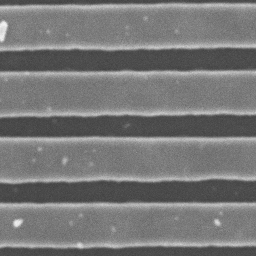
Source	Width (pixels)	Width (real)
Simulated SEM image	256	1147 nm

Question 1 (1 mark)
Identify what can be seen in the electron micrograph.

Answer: lines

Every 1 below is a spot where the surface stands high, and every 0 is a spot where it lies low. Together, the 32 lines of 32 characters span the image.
00000000000000000001111111111111
11111111111111111111111111111111
11111111111111111111111111111111
11111111111111111111111111111111
11111111111111111111111111111111
11111111111111111111111111111111
00000000000000000000000000000000
00000000000000000000000000000000
00000000000000000000000000000000
11111111111111111111111111111111
11111111111111111111111111111111
11111111111111111111111111111111
11111111111111111111111111111111
11111111111111111111111111111111
11101110001000000000000000000000
00000000000000000000000000000000
00000000000000000000000000000000
11111111111111111111111111111111
11111111111111111111111111111111
11111111111111111111111111111111
11111111111111111111111111111111
11111111111111111111111111111111
11111111111111111111111110000011
00000000000000000000000000000000
00000000000000000000000000000000
10111111111111111111111111111111
11111111111111111111111111111111
11111111111111111111111111111111
11111111111111111111111111111111
11111111111111111111111111111111
11111111111111111111111111111111
00000000000000000000000000000000